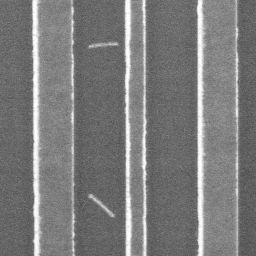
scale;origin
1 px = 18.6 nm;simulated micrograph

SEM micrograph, lines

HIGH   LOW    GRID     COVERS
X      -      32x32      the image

----XXXXX-------XX-------XXXXX--
----XXXXX-------XX-------XXXXX--
----XXXXX-------XX-------XXXXX--
----XXXXX-------XX-------XXXXX--
----XXXXX-------XX-------XXXXX--
----XXXXX-------XX-------XXXXX--
----XXXXX-------XX-------XXXXX--
----XXXXX-------XX-------XXXXX--
----XXXXX-------XX-------XXXXX--
----XXXXX-------XX-------XXXXX--
----XXXXX-------XX-------XXXXX--
----XXXXX-------XX-------XXXXX--
----XXXXX-------XX-------XXXXX--
----XXXXX-------XX-------XXXXX--
----XXXXX-------XX-------XXXXX--
----XXXXX-------XX-------XXXXX--
----XXXXX-------XX-------XXXXX--
----XXXXX-------XX-------XXXXX--
----XXXXX-------XX-------XXXXX--
----XXXXX-------XX-------XXXXX--
----XXXXX-------XX-------XXXXX--
----XXXXX-------XX-------XXXXX--
----XXXXX-------XX-------XXXXX--
----XXXXX-------XX-------XXXXX--
----XXXXX-------XX-------XXXXX--
----XXXXX-------XX-------XXXXX--
----XXXXX-------XX-------XXXXX--
----XXXXX-------XX-------XXXXX--
----XXXXX-------XX-------XXXXX--
----XXXXX-------XX-------XXXXX--
----XXXXX-------XX-------XXXXX--
----XXXXX-------XX-------XXXXX--